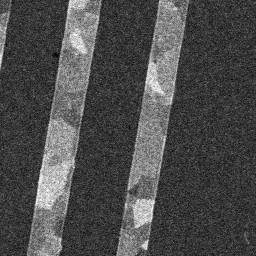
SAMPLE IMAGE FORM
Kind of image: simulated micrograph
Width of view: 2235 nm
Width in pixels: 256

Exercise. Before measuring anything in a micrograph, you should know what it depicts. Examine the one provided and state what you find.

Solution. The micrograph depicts one or a few lines or trenches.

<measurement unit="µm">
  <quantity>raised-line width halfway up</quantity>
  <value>0.251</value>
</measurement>